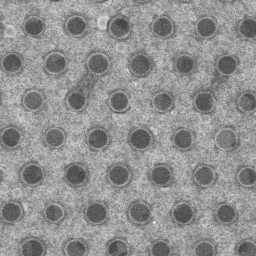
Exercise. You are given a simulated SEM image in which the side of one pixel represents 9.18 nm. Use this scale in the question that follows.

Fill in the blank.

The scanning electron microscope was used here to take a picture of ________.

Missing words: a regular array of raised bodies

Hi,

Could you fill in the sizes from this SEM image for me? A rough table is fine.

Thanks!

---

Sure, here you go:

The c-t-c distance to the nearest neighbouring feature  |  390 nm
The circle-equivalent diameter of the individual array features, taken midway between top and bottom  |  190 nanometres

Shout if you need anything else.